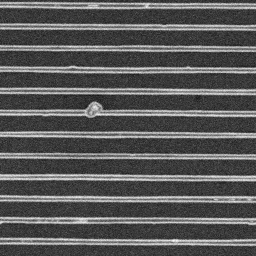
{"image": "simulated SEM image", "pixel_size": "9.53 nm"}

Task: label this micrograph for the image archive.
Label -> parallel lines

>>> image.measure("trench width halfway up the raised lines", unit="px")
17.5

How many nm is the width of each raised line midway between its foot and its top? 44.1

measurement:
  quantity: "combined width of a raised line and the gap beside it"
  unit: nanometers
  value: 205